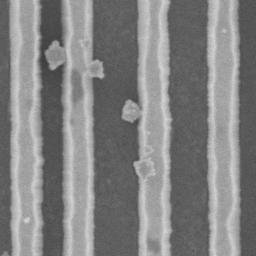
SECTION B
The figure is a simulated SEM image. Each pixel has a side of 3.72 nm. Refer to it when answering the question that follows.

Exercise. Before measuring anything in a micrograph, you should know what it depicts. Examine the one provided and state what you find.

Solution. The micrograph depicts lines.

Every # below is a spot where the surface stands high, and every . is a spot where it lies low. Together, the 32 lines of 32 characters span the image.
..###...###.......###.....###...
..###...###.......###.....###...
..###...###.......###.....###...
..###...###.......###.....####..
..###...###.......###.....####..
..###.#.###.......###.....####..
..###.#####.......###.....####..
..###.######......###.....####..
..###.#.#####.....###.....####..
..###...#####.....###.....####..
..###...###.......###.....####..
..###...###.......###.....####..
..###...###.......###.....####..
..###...###....######.....####..
..###...###....######.....####..
..###...###.......###.....####..
..###...###.......###.....###...
..###...###.......###.....####..
..###...###.......###.....####..
..###...####......###.....####..
..###...####.....####.....####..
..###...####.....####.....####..
..###...####......###.....####..
..###...####......###.....####..
..###...####......###.....####..
..###...####......###.....####..
..###...####......###.....####..
..###...###.......###.....####..
..###...###.......###.....###...
..###...###.......###.....####..
..###...###.......###.....####..
..###...####......###.....####..